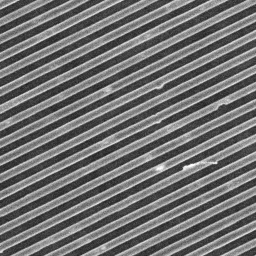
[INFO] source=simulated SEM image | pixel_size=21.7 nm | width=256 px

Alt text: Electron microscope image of parallel lines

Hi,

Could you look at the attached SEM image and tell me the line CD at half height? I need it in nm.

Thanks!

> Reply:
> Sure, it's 170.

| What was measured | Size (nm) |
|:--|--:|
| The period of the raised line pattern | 336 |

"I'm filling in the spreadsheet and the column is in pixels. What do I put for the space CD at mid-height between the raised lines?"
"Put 7.95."